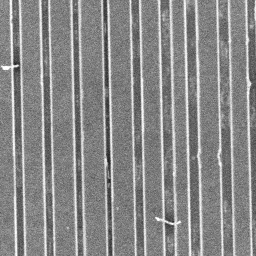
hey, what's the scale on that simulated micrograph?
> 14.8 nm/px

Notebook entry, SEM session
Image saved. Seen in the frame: parallel lines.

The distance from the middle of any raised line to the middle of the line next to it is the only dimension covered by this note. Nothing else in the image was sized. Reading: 438 nanometres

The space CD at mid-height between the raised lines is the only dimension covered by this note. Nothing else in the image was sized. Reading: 0.122 um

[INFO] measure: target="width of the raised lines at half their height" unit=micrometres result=0.325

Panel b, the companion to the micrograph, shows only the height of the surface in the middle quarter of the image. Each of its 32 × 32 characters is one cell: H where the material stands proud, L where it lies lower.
HHLLHHHHHHLHHHHHHLLHHHHHLLLHHHHL
HHLLHHHHHHLHHHHHHLLHHHHHLLLHHHHL
HHLLHHHHHHLHHHHHHLLHHHHHLLLHHHHL
HHLLHHHHHHLLHHHHHLLLHHHHLLLHHHHL
HHLLHHHHHHLLHHHHHLLLHHHHLLLHHHHL
HHLLHHHHHHLLHHHHHLLLHHHHLLLHHHHL
HHLLHHHHHHLLHHHHHLLLHHHHLLLHHHHL
HHLLHHHHHHLLHHHHHLLLHHHHLLLHHHHL
HHLLHHHHHHLLHHHHHLLLHHHHLLLHHHHL
HHLLHHHHHHLLHHHHHLLLHHHHLLLHHHHL
HHLLHHHHHHLLHHHHHLLLHHHHLLLHHHHL
HHLLHHHHHHLLHHHHHLLLHHHHLLLHHHHL
HHLLHHHHHHLLHHHHHLLLHHHHLLLHHHHL
HHLLHHHHHHLLHHHHHLLLHHHHLLLHHHHL
HHLLHHHHHHLLHHHHHLLLHHHHLLLHHHHL
HHLLHHHHHHLLHHHHHLLLHHHHLLLHHHHL
HHLLHHHHHHLLHHHHHLLLHHHHLLLHHHHL
HHLLHHHHHHLLHHHHHLLLHHHHLLLHHHHL
HHLLLHHHHHLLHHHHHLLLHHHHLLLHHHHL
HHLLLHHHHHLLHHHHHLLLHHHHLLLHHHHL
HHLLLHHHHHLLHHHHHLLLHHHHLLLHHHHL
HHHLLHHHHHLLHHHHHLLLHHHHLLLHHHHL
HHHLLHHHHHLLHHHHHLLLHHHHLLLHHHHL
HHHLLHHHHHHLHHHHHLLLHHHHHLLHHHHL
HHHLLHHHHHHLHHHHHLLLHHHHHLLLHHHL
HHHLLHHHHHLLHHHHHLLLHHHHHLLLHHHL
HHHLLHHHHHLLHHHHHLLLHHHHHLLLHHHL
HHHLLHHHHHLLHHHHHHLLHHHHHLLHHHHL
HHHLLHHHHHLLHHHHHHLLHHHHHLLLHHHL
HHHLLHHHHHLLHHHHHHLLHHHHHLLLHHHL
HHHLLHHHHHLLHHHHHHLLHHHHHLLLHHHL
HHHLLHHHHHHLHHHHHHLLHHHHHLLLHHHL